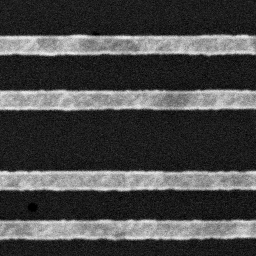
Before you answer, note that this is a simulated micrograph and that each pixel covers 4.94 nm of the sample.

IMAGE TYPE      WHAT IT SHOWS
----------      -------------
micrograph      lines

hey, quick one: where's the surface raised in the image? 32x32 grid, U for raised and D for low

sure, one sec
DDDDDDDDDDDDDDDDDDDDDDDDDDDDDDDD
DDDDDDDDDDDDDDDDDDDDDDDDDDDDDDDD
DDDDDDDDDDDDDDDDDDDDDDDDDDDDDDDD
DDDDDDDDDDDDDDDDDDDDDDDDDDDDDDDD
DDDDDDDDDUUDDDDDDDDDDDDDDUUUUDUD
UUUUUUUUUUUUUUUUUUUUUUUUUUUUUUUU
UUUUUUUUUUUUUUUUUUUUUUUUUUUUUUUU
DDDDDDDDDDDDDDDDDDDDDDDDDDDDDDDD
DDDDDDDDDDDDDDDDDDDDDDDDDDDDDDDD
DDDDDDDDDDDDDDDDDDDDDDDDDDDDDDDD
DDDDDDDDDDDDDDDDDDDDDDDDDDDDDDDD
UUUUUUUUUUUUUUUUUUUUUUUUUUUUUUUU
UUUUUUUUUUUUUUUUUUUUUUUUUUUUUUUU
UUUUUUUUUUUUUDDDDDDUUUUUUUUUDDDD
DDDDDDDDDDDDDDDDDDDDDDDDDDDDDDDD
DDDDDDDDDDDDDDDDDDDDDDDDDDDDDDDD
DDDDDDDDDDDDDDDDDDDDDDDDDDDDDDDD
DDDDDDDDDDDDDDDDDDDDDDDDDDDDDDDD
DDDDDDDDDDDDDDDDDDDDDDDDDDDDDDDD
DDDDDDDDDDDDDDDDDDDDDDDDDDDDDDDD
DDDDDDDDDDDDDDDDDDDDDDDDDDDDDDDD
DDDDDDDDDDDDDDDDDDDDDDDDDDDDDDDD
UUUUUUUUUUUUUUUUUUUUUUUUUUUUUUUU
UUUUUUUUUUUUUUUUUUUUUUUUUUUUUUUU
DDDDDDDDDDDDDDDDDDDDDDDDDDDDDDDD
DDDDDDDDDDDDDDDDDDDDDDDDDDDDDDDD
DDDDDDDDDDDDDDDDDDDDDDDDDDDDDDDD
DDDDDDDDDDDDDDDDDDDDDDDDDDDDDDDD
UUUUUUUUUUUUUUUUUUUUUUUUUUUUUUUU
UUUUUUUUUUUUUUUUUUUUUUUUUUUUUUUU
DDDDDDDDDDDDDDDDDDDDDDDDDDDDDDDD
DDDDDDDDDDDDDDDDDDDDDDDDDDDDDDDD